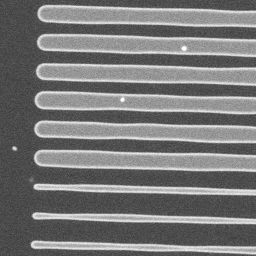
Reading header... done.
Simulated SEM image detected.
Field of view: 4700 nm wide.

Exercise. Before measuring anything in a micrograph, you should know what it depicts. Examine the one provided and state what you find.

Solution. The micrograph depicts groups of lines, slits or small figures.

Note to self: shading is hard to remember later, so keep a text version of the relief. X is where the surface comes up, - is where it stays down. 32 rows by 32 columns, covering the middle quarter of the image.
XXXXXXXXXXXXXXXXXX--------------
XXXXXXXXXXXXXXXXXXXXXXXXXXXXXXXX
XXXXXXXXXXXXXXXXXXXXXXXXXXXXXXXX
XXXXXXXXXXXXXXXXXXXXXXXXXXXXXXXX
-------------------XXXXXXXXXXXXX
--------------------------------
--------------------------------
XXXXXXXXX-----------------------
XXXXXXXXXXXXXXXXXXXXXXXXXXXXXXXX
XXXXXXXXXXXXXXXXXXXXXXXXXXXXXXXX
XXXXXXXXXXXXXXXXXXXXXXXXXXXXXXXX
------------------XXXXXXXXXXXXXX
--------------------------------
--------------------------------
--------------------------------
XXXXXXXXXXXXXXXXXXXXXXXXXXXXXXXX
XXXXXXXXXXXXXXXXXXXXXXXXXXXXXXXX
XXXXXXXXXXXXXXXXXXXXXXXXXXXXXXXX
------XXXXX------XXXXXXXXXXXXXXX
--------------------------------
--------------------------------
--------------------------------
XXXXXXXXXXXXXXXXXXXXXXXXXXXX--XX
XXXXXXXXXXXXXXXXXXXXXXXXXXXXXXXX
XXXXXXXXXXXXXXXXXXXXXXXXXXXXXXXX
XXXXXXXXXXXXXXXXXXXXXXXXXXXXXXXX
-------------------------------X
--------------------------------
--------------------------------
--------------------------------
XXXXXXXXXXX---------------------
-XXXXXXXXXXXXXXXXXXXXXXXXXXXXXXX